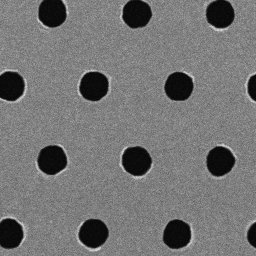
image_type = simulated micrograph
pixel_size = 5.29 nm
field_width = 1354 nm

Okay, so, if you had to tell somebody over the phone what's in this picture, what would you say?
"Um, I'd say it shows holes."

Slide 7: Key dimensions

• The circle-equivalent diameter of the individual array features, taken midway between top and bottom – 0.152 micrometres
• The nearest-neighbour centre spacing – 442 nanometers